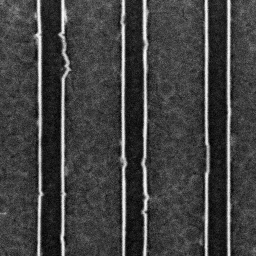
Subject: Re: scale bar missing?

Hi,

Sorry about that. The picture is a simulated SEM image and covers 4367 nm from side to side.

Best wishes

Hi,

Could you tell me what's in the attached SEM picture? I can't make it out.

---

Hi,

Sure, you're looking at one or a few lines or trenches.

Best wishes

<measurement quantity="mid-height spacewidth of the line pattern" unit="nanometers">1030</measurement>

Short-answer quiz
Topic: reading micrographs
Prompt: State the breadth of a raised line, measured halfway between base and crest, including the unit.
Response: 0.388 micrometres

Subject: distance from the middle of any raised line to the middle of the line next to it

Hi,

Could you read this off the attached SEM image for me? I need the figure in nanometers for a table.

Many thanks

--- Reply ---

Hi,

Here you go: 1420